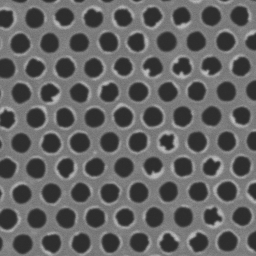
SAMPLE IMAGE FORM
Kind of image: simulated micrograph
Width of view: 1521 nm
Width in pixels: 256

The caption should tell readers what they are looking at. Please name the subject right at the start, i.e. a regular array of holes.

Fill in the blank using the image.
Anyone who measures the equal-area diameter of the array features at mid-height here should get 112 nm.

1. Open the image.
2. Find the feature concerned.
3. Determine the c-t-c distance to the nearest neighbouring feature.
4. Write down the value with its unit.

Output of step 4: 0.17 microns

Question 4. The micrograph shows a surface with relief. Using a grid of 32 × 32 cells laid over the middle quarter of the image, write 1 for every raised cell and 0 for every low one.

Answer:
00011000001110000111000001100000
00011000001110000111100011100000
00111100011111001111100011110101
11111111111111111111111111111111
11111111111111111111111111011111
11100111110001111000111100001110
11000011100000110000011100001110
11000011100000110000011100001110
11000011100001111000111100001110
11111111111111111111111111111111
11111111111111111111111111111111
01111100011110001111000011110001
00111000001100000111000001100000
00111000001100000111000001100000
00111000001110000111000011110000
00111100011111011111110111111011
11111111111111111111111111111111
11100111110001111000111111111111
11000011100001110000011100011110
11000011100000110000011100011110
11000011100001110000011100011110
11000011110001111000111111111111
11111111111111111111111111111111
11111110011111001111110111111001
00111100001110000111000011110000
00011000001110000111000011110000
00011000001110000111000011110000
00111100011110000111101111110001
11111111111111111111111111111111
11111111111111111111111111011111
11100011110001111000111110001111
11000011100000110000011100000110